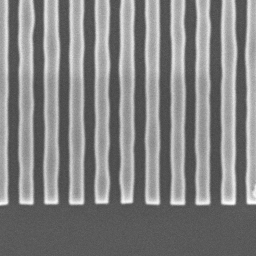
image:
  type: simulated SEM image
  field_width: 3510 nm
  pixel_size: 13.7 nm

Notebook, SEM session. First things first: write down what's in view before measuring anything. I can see groups of lines, slits or small figures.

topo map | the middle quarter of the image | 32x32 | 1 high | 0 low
00111000111000111000011100011100
00111000111000111000011100011100
00111000111000111000011100011100
00111000111000111000011100011100
00111000111000111000011000011100
00111000111000111000011100011100
00111000111000111000011100011100
00111000111000111000011100011100
00111000111000111000011100011100
00111000111000111000011100011100
00111000111000111000011000011100
00111000111000111000011000011100
00111000111000111000011000011100
00111000111000111000011000011100
00111000111000111000011100011100
00111000111000111000011100011100
00111000111000111000011100011100
00111000111000111000011100011100
00111000111000111000011100011100
00111000111000111000011100011100
00111000111000111000011100011100
00111000111000111000011100011100
00111000111000111000011100011100
00111000111000111000011000011100
00111000111000111000011100011100
00111000111000111000011100011100
00111000111000111000011100011100
00111000111000111000011100011100
00111000111000111000011000011100
00111000111000111000011100011100
00111000111000111000011100011100
00111000111000011000011100011100